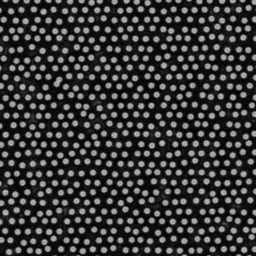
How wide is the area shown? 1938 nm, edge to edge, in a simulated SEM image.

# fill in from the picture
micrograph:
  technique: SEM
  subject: a regular array of raised bodies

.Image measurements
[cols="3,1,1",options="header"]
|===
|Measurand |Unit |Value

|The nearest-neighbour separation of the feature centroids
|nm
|71.1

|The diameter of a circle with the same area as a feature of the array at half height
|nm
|41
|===